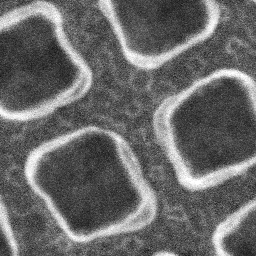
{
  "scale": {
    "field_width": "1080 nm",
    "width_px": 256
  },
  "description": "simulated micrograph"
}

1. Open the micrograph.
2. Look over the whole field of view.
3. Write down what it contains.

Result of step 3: raised bodies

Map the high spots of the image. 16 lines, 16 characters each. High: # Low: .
.......######...
####...######...
####....####....
#####...##......
#####...........
#####.......####
####.......#####
..........######
....###...######
...#####...#####
..######...####.
..#######...#...
...######.......
....#####......#
#...##........##
#.............##